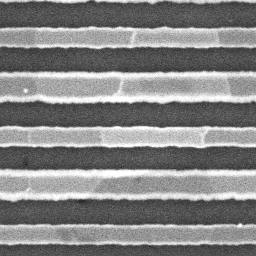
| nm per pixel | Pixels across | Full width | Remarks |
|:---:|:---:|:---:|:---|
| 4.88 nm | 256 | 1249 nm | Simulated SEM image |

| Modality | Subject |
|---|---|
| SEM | lines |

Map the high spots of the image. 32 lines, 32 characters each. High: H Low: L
LLLLLLLLLLLLLLLLLLLLLLLLLLLLLLLL
LLLLLLLLLLLLLLLLLLLLLLLLLLLLLLLL
LLLLLLLLLLLLLLLLLLLLLLLLLLLLLLLL
LLLLLLLLLLLHLLLLLLLLHLLLLLLLLLLL
HHHHHHHHHHHHHHHHHHHHHHHHHHHHHHHH
HHHHHHHHHHHHHHHHHHHHHHHHHHHHHHHH
LLLLLLLLLLLLLLLLLLLLLLLLLLLLLLLL
LLLLLLLLLLLLLLLLLLLLLLLLLLLLLLLL
LLLLLLLLLLLLLLLLLLLLLLLLLLLLLLLL
HHHHHHHHHHHHHHHHHHHHHHHHHHHHHHHH
HHHHHHHHHHHHHHHHHHHHHHHHHHHHHHHH
HHHHHHHHHHHHHHHHHHHHHHHHHHHHHHHH
HHHHLHHHHHHHHHHHHLHHHHHHHHHLHHHH
LLLLLLLLLLLLLLLLLLLLLLLLLLLLLLLL
LLLLLLLLLLLLLLLLLLLLLLLLLLLLLLLL
LLLLLLLLLLLLLLLLLLLLLLLLLLLLLLLL
HHHHHHHHHHHHHHHHHHHHHHHHHHHHHHHH
HHHHHHHHHHHHHHHHHHHHHHHHHHHHHHHH
LLLLLLLLLLLLLLLLLLLLLLLLLLLLLLLL
LLLLLLLLLLLLLLLLLLLLLLLLLLLLLLLL
LLLLLLLLLLLLLLLLLLLLLLLLLLLLLLLL
HHHLLHHLHHLHLHHHHHHHHHLHHLHHHHHH
HHHHHHHHHHHHHHHHHHHHHHHHHHHHHHHH
HHHHHHHHHHHHHHHHHHHHHHHHHHHHHHHH
HHHHHHHHHHHHHHHHHHHHHHHHHHHHHHHH
LLLLLLLLLLLLLLLLLLLLLLLLLLLLLLLL
LLLLLLLLLLLLLLLLLLLLLLLLLLLLLLLL
LLLLLLLLLLLLLLLLLLLLLLLLLLLLLLLL
HHHHHHHHHHHHHHHHHHHHHHHHHHHHHHHH
HHHHHHHHHHHHHHHHHHHHHHHHHHHHHHHH
LHLLLLLLHHLLHLLHHHHHHHHHHLHHHHLL
LLLLLLLLLLLLLLLLLLLLLLLLLLLLLLLL